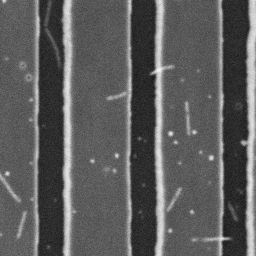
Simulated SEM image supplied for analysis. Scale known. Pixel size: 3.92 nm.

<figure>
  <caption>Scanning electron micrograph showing lines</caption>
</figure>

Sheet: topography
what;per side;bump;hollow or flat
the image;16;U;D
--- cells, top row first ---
UUDDUUUUDDUUUUDD
UUDDUUUUDDUUUUDD
UUDDUUUUDDUUUUDD
UUDDUUUUDDUUUUDD
UUDDUUUUDDUUUUDD
UUDDUUUUDDUUUUDD
UUDDUUUUDDUUUUDD
UUDDUUUUDDUUUUDD
UUDDUUUUDDUUUUDD
UUDDUUUUDDUUUUDD
UUDDUUUUDDUUUUDD
UUDDUUUUDDUUUUDD
UUDDUUUUDDUUUUDD
UUDDUUUUDDUUUUDD
UUDDUUUUDDUUUUDD
UUDDUUUUDDUUUUDD